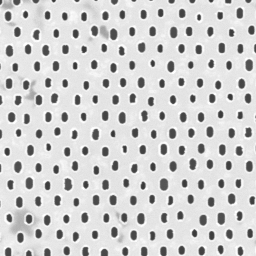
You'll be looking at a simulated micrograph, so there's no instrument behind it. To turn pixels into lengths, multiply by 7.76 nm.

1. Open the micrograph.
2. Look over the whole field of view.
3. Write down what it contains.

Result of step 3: a regular array of holes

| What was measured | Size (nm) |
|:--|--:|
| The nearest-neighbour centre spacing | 134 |